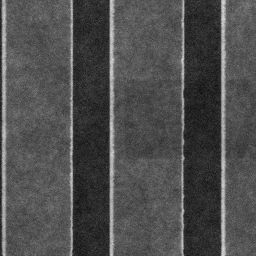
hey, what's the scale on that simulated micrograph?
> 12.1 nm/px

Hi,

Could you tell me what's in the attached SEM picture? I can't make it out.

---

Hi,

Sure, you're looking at lines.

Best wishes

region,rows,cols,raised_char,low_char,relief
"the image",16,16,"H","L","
HHHHHLLHHHHLLLHH
HHHHHLLHHHHLLLHH
HHHHHLLHHHHLLLHH
HHHHHLLHHHHLLLHH
HHHHHLLHHHHLLLHH
HHHHHLLHHHHLLLHH
HHHHHLLHHHHLLLHH
HHHHHLLHHHHLLLHH
HHHHHLLHHHHLLLHH
HHHHHLLHHHHLLLHH
HHHHHLLHHHHLLLHH
HHHHHLLHHHHLLLHH
HHHHHLLHHHHLLLHH
HHHHHLLHHHHLLLHH
HHHHHLLHHHHLLLHH
HHHHHLLHHHHLLLHH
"